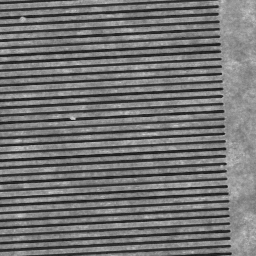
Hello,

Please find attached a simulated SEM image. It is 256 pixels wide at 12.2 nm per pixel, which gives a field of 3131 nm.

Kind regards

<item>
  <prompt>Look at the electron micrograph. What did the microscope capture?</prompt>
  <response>parallel lines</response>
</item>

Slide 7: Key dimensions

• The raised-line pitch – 91.6 nanometers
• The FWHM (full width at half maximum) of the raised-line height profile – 4.5 pixels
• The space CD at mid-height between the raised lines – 2.75 pixels